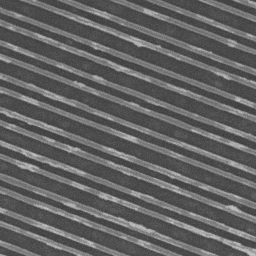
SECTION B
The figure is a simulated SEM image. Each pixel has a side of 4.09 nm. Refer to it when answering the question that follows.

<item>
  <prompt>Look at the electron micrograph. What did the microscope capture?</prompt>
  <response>parallel lines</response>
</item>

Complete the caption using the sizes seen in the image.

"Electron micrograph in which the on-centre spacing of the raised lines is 63.7 nm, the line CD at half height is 19.6 nm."